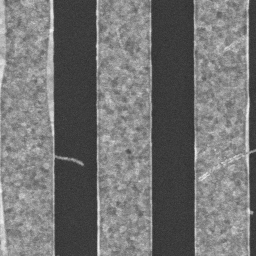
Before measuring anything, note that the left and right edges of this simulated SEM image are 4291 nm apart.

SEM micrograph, wiring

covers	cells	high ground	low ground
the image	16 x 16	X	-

XXX---XXX---XXXX
XXX---XXX---XXXX
XXX---XXX---XXX-
XXX---XXX---XXX-
XXX---XXX---XXXX
XXX---XXX---XXXX
XXX---XXX---XXXX
XXX---XXX---XXX-
XXX---XXX---XXX-
XXX---XXX---XXXX
XXX---XXX---XXXX
XXX---XXX---XXXX
XXX---XXX---XXXX
XXX---XXX---XXXX
XXX---XXX---XXXX
XXX---XXX---XXXX